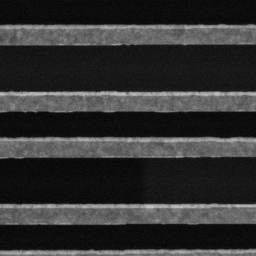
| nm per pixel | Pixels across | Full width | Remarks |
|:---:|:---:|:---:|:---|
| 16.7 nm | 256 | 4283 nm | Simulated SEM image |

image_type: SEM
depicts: lines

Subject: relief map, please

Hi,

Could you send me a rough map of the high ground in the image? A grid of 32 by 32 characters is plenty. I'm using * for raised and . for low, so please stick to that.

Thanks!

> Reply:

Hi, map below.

................................
................................
................................
********************************
********************************
*****************......*........
................................
................................
................................
................................
................................
................................
********************************
********************************
................................
................................
................................
********************************
********************************
********************************
................................
................................
................................
................................
................................
................................
********************************
********************************
................................
................................
................................
.........****..*****************